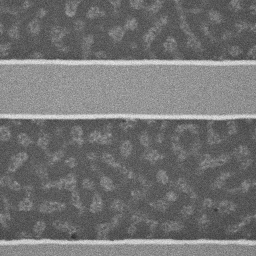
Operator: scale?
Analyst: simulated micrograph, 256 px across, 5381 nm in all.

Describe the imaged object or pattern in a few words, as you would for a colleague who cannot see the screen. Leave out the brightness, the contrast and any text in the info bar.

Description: one or a few lines or trenches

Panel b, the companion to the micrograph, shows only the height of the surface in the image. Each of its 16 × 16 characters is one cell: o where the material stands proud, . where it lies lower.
................
................
................
................
oooooooooooooooo
oooooooooooooooo
oooooooooooooooo
................
................
................
................
................
................
................
................
oooooooooooooooo